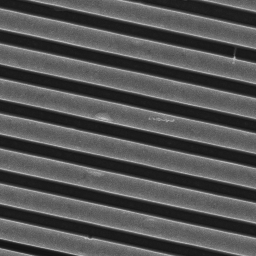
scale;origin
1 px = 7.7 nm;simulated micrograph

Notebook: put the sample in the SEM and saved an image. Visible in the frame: parallel lines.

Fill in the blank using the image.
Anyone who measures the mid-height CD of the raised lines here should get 176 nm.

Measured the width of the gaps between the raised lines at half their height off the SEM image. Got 0.0876 um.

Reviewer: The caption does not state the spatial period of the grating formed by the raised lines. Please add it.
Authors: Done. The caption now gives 263 nm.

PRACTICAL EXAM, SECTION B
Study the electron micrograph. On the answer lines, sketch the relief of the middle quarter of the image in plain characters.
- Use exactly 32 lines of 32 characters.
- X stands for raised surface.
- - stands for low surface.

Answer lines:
XXXXXXXXXXXX-------------XXXXXXX
XXXXXXXXXXXXXXXXX-------------XX
XXXXXXXXXXXXXXXXXXXXX-----------
XXXXXXXXXXXXXXXXXXXXXXXXXX------
----XXXXXXXXXXXXXXXXXXXXXXXXXXX-
---------XXXXXXXXXXXXXXXXXXXXXXX
-------------XXXXXXXXXXXXXXXXXXX
XXXX-------------XXXXXXXXXXXXXXX
XXXXXXXXX-------------XXXXXXXXXX
XXXXXXXXXXXXX-------------XXXXXX
XXXXXXXXXXXXXXXXXX-------------X
XXXXXXXXXXXXXXXXXXXXXX----------
XXXXXXXXXXXXXXXXXXXXXXXXXX------
----XXXXXXXXXXXXXXXXXXXXXXXXXXX-
---------XXXXXXXXXXXXXXXXXXXXXXX
-------------XXXXXXXXXXXXXXXXXXX
XXXX--------------XXXXXXXXXXXXXX
XXXXXXXXXX-------------XXXXXXXXX
XXXXXXXXXXXXX--------------XXXXX
XXXXXXXXXXXXXXXXXX--------------
XXXXXXXXXXXXXXXXXXXXXXX---------
-XXXXXXXXXXXXXXXXXXXXXXXXXX-----
------XXXXXXXXXXXXXXXXXXXXXXXXXX
-----------XXXXXXXXXXXXXXXXXXXXX
X---------------XXXXXXXXXXXXXXXX
XXXXX---------------XXXXXXXXXXXX
XXXXXXXXXX--------------XXXXXXXX
XXXXXXXXXXXXXXX---------------XX
XXXXXXXXXXXXXXXXXXX-------------
XXXXXXXXXXXXXXXXXXXXXXXX--------
---XXXXXXXXXXXXXXXXXXXXXXXXXX---
-------XXXXXXXXXXXXXXXXXXXXXXXXX